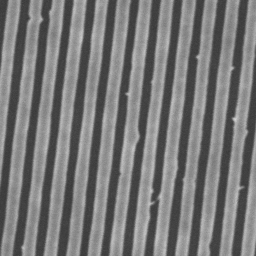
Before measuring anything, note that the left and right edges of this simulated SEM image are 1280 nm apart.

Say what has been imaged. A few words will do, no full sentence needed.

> parallel lines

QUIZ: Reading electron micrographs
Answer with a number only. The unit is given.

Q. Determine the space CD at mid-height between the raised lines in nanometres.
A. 48.4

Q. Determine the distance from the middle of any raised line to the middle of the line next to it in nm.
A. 108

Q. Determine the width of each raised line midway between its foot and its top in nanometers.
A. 62.1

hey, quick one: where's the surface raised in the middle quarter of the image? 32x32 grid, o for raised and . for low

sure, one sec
.ooo..ooo...ooo..ooo...oo...ooo.
ooo...ooo..ooo...ooo...oo...ooo.
ooo...ooo..ooo...ooo...oo...ooo.
ooo...ooo..ooo...ooo..ooo...ooo.
ooo...oo...ooo..oooo..ooo..ooo..
ooo...oo...ooo..ooo...ooo..ooo..
ooo...oo...ooo..ooo...ooo..ooo..
ooo..ooo...ooo..ooo...ooo..ooo..
ooo..ooo..oooo..ooo...ooo..ooo..
ooo..ooo..ooo...ooo...oo...ooo..
oo...ooo..ooo...ooo..ooo...ooo..
oo...ooo..ooo...ooo..ooo...ooo..
oo...ooo..ooo...ooo..ooo...oo...
oo...oo...ooo...ooo..ooo..ooo...
oo...oo...ooo...ooo..ooo..ooo...
oo..ooo...ooo..ooo...ooo..ooo...
oo..ooo...ooo..ooo...oo...ooo...
oo..ooo..oooo..oooo..oo...ooo...
o...ooo..ooo...oooo.ooo...ooo..o
o...ooo..ooo...ooo..ooo...ooo..o
o...ooo..ooo...ooo..ooo...ooo..o
o...ooo..ooo...ooo..ooo..ooo...o
o...oo...ooo...oo...ooo..ooo...o
o...oo...ooo..ooo...ooo..ooo...o
o..ooo...ooo..ooo...oo...ooo...o
o..ooo...ooo..ooo...ooo..ooo...o
o..ooo...ooo..ooo...oo...ooo..oo
...ooo..ooo...ooo..ooo...ooo..oo
...ooo..ooo...ooo..ooo...ooo..oo
...ooo..ooo...ooo..ooo...ooo..oo
...ooo..ooo...oo...ooo..ooo...oo
..ooo...ooo...oo...ooo..ooo...oo